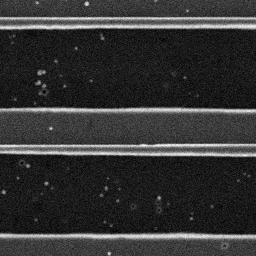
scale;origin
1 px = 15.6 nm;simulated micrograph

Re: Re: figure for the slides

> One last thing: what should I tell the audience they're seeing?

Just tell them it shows lines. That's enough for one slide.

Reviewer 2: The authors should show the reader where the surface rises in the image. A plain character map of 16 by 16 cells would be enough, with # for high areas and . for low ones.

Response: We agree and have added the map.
################
################
................
................
................
................
................
################
################
.###############
................
................
................
................
................
################